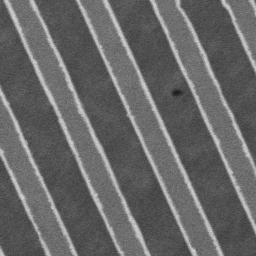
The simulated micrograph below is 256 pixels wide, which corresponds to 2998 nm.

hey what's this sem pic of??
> one or a few lines or trenches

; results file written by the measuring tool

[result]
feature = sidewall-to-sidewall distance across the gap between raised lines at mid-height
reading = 493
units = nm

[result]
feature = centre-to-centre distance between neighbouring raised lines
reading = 778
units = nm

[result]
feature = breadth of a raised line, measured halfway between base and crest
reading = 292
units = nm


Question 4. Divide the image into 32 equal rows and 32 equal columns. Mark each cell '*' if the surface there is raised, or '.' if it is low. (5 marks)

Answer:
.***......***......***......****
.****.....****......***......***
..***......***......***......***
..****.....****......***......**
...***......***......***......**
...****.....****.....****......*
....***......***......***......*
....***......****.....****.....*
.....***......***......***......
.....***......***......****.....
.....****.....****......***.....
......***......***......***.....
*.....****.....****......***....
*......***......***......***....
**.....****.....****......***...
**......***......***......***...
**......***......****.....****..
***......***......***......***..
***......***......****.....****.
****......***......***......***.
.***......***......***......****
.****.....****.....****......***
..***......***......***......***
..****.....****.....****......**
...***......***......***......**
...****.....****.....****.....**
....***......***......***......*
....***......***......****.....*
.....***......***......***......
.....***......***......****.....
.....****......***......***.....
......***......***......***.....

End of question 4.